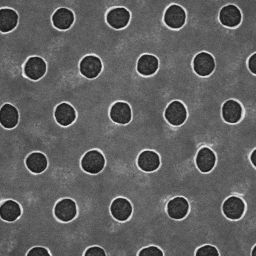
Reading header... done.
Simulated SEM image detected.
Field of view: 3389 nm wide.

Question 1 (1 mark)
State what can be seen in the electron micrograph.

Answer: a regular array of holes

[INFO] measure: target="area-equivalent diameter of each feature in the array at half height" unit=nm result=297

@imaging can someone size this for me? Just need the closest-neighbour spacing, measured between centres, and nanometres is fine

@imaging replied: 728